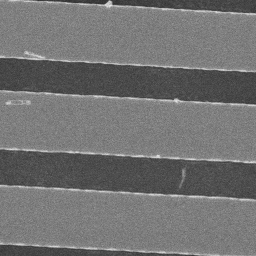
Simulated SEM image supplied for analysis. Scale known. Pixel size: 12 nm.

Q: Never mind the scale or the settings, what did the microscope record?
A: lines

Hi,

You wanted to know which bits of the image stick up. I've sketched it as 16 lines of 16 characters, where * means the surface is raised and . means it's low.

**********......
****************
****************
****************
................
................
**************..
****************
****************
....************
................
................
****************
****************
****************
.....***********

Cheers